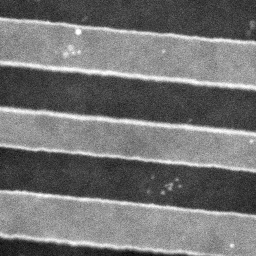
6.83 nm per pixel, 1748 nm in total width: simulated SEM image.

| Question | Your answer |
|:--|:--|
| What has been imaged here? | lines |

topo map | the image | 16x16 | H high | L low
LLLLLLLLLLLLLLLL
HHHHLLLLLLLLLLLL
HHHHHHHHHHHHHHLL
HHHHHHHHHHHHHHHH
LLLLLLHHHHHHHHHH
LLLLLLLLLLLLLLLL
LLLLLLLLLLLLLLLL
HHHHHHHLLLLLLLLL
HHHHHHHHHHHHHHHH
LLLLHHHHHHHHHHHH
LLLLLLLLLLLLLLHH
LLLLLLLLLLLLLLLL
HHHHHHLLLLLLLLLL
HHHHHHHHHHHHHHHH
HHHHHHHHHHHHHHHH
LLLLLLLLHHHHHHHH